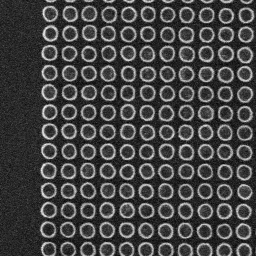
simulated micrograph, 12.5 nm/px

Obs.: a regular array of raised bodies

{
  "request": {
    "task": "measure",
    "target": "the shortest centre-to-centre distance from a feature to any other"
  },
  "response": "240 nm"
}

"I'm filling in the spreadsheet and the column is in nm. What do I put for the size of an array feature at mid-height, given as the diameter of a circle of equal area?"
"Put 183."